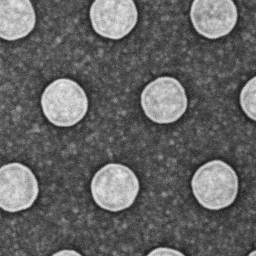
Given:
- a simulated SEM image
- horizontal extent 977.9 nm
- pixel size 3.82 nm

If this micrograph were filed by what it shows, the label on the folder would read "raised bodies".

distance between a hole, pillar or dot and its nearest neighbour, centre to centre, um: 0.377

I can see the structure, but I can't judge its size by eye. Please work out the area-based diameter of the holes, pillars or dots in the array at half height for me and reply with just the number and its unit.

171 nm